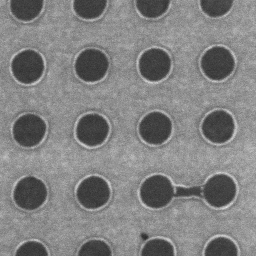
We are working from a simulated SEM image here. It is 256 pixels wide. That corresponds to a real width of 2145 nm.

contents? a regular array of raised bodies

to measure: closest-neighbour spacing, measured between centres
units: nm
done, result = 526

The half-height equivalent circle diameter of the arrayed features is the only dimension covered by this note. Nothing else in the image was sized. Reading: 303 nm